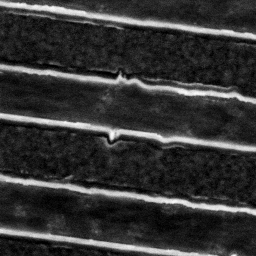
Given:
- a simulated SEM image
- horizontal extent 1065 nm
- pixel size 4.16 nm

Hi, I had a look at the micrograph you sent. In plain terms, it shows one or a few lines or trenches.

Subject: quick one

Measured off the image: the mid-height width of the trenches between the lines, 255 nm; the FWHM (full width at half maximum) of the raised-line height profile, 51.1 pixels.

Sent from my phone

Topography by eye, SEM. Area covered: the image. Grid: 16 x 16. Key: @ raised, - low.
--@@@@@@@@@@@@@@
---------@@@@@@@
----------------
----------------
@@@-------------
@@@@@@@@@@@-----
@@@@@@@@@@@@@@@@
--@@@@@@@@@@@@@@
---------@@@@@@@
----------------
----------------
@@@-------------
@@@@@@@@@@@-----
@@@@@@@@@@@@@@@@
@@@@@@@@@@@@@@@@
--------@@@@@@@@